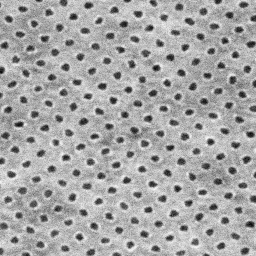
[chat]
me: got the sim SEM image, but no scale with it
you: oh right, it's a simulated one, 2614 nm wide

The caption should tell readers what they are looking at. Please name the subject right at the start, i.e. a regular array of raised bodies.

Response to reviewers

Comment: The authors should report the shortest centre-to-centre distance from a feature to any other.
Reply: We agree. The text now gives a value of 178 nm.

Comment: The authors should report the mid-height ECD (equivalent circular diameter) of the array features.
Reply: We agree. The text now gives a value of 99.1 nm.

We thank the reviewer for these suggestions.